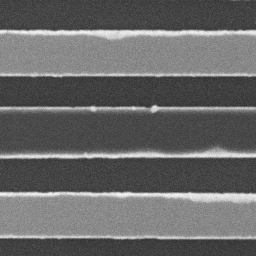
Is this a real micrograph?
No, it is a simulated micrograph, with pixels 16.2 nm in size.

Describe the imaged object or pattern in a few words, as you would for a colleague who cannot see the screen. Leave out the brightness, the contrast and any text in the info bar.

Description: lines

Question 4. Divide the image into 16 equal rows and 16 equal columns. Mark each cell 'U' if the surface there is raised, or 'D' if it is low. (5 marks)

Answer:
DDDDDDDDDDDDDDDD
DDDDDDDDDDDDDDDD
UUUUUUUUUUUUUUUU
UUUUUUUUUUUUUUUU
UUUUUUUUUUUUUUUU
DDDDDDDDDDDDDDDD
DDDDDDDDDDDDDDDD
UUUUUUUUUUUUUUUU
UUUUUUUUUUUUUUUU
UUUUUUUUUUUUUUUU
DDDDDDDDDDDDDDDD
DDDDDDDDDDDDDDDD
UUUUUUUUUUUUUUUU
UUUUUUUUUUUUUUUU
UUUUUUUUUUUUUUUU
DDDDDDDDDDDDDDDD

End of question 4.